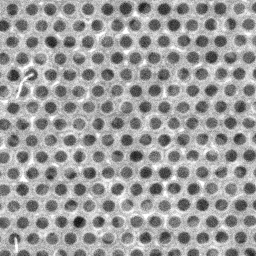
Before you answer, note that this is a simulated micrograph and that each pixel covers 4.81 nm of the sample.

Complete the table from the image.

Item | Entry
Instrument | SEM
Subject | a regular array of raised bodies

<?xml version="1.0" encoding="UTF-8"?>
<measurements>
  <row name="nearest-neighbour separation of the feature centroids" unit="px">18.5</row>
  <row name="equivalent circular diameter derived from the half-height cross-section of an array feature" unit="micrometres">0.0695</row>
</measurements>